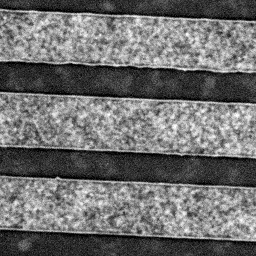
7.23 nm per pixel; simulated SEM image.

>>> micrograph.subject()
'one or a few lines or trenches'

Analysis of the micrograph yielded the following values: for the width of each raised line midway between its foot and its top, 386 nm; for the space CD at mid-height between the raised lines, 0.22 um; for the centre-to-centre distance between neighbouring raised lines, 605 nm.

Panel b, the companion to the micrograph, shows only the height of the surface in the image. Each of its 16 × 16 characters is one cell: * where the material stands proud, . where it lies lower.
................
****************
****************
****************
..............**
................
***************.
****************
****************
........********
................
**********......
****************
****************
....************
................